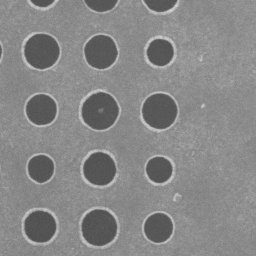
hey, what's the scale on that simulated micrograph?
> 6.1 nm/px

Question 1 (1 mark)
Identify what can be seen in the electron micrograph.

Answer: a regular array of holes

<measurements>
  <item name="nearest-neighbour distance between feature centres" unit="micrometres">0.356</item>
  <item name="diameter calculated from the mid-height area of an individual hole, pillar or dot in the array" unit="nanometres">205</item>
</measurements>